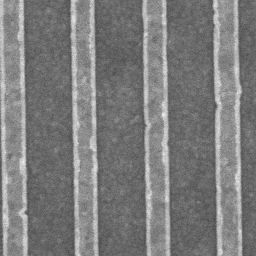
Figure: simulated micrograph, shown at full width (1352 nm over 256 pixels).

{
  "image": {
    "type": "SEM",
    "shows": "one or a few lines or trenches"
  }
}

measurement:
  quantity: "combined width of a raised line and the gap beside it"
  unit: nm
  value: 378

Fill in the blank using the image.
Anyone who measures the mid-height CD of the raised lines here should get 108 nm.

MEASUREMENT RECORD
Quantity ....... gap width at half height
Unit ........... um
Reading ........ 0.272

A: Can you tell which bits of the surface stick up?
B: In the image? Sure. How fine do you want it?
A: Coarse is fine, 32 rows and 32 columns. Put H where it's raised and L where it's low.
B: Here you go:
HHHLLLLLLHHLLLLLLLHHHLLLLLLHHLLL
HHHLLLLLLHHHLLLLLLHHHLLLLLLHHLLL
HHHLLLLLLHHHLLLLLLHHHLLLLLLHHHLL
HHHLLLLLLHHHLLLLLLHHHLLLLLLHHHLL
HHHLLLLLLHHHLLLLLLHHHLLLLLLHHHLL
HHHLLLLLLHHHLLLLLLHHHLLLLLLHHHLL
HHHLLLLLLHHHLLLLLLHHHLLLLLLHHHLL
HHHLLLLLLHHHLLLLLLHHHLLLLLLHHHLL
HHHLLLLLLHHHLLLLLLHHHLLLLLLHHHLL
HHHLLLLLLHHHLLLLLLHHHLLLLLLHHHLL
HHHLLLLLLHHHLLLLLLHHHLLLLLLHHHLL
HHHLLLLLLHHHLLLLLLHHHLLLLLLHHHLL
HHHLLLLLLHHHLLLLLLHHHLLLLLLHHHLL
HHHLLLLLLHHHLLLLLLHHHLLLLLLHHHLL
HHHLLLLLLHHHLLLLLLHHHLLLLLLHHHLL
HHHLLLLLLHHHLLLLLLHHHLLLLLLHHHLL
HHHLLLLLLHHHLLLLLLHHHLLLLLLHHHLL
HHHLLLLLLHHHLLLLLLHHHLLLLLLHHHLL
HHHLLLLLLLHHLLLLLLHHHLLLLLLHHHLL
HHHLLLLLLLHHLLLLLLHHHLLLLLLHHHLL
LHHLLLLLLLHHLLLLLLHHHLLLLLLHHHLL
LHHLLLLLLLHHLLLLLLHHHLLLLLLHHHLL
LHHLLLLLLLHHLLLLLLHHHLLLLLLHHHLL
LHHLLLLLLLHHLLLLLLHHHLLLLLLHHHLL
LHHLLLLLLLHHLLLLLLHHHLLLLLLHHHLL
HHHLLLLLLLHHLLLLLLHHHLLLLLLHHHLL
HHHLLLLLLLHHLLLLLLHHHLLLLLLHHHLL
LHHLLLLLLLHHLLLLLLLHHLLLLLLHHHLL
LHHLLLLLLLHHLLLLLLLHHLLLLLLHHHLL
LHHLLLLLLLHHLLLLLLLHHLLLLLLHHHLL
LHHLLLLLLLHHLLLLLLLHHLLLLLLHHHLL
LHHLLLLLLLHHLLLLLLLHHLLLLLLHHHLL